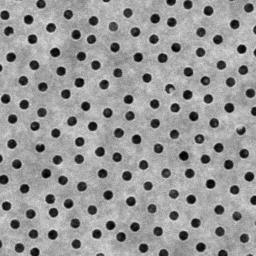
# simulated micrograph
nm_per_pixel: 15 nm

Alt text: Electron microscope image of a regular array of holes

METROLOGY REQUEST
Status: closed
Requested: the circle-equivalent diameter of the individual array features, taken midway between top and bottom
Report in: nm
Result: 155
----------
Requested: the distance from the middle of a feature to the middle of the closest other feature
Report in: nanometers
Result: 291